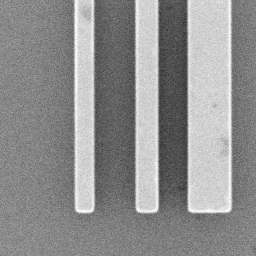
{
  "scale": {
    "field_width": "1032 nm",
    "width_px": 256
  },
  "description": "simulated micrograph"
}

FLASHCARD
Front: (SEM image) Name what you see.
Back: groups of lines, slits or small figures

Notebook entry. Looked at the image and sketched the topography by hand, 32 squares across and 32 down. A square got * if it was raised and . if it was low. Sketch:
.........***.....***....*****...
.........***.....***....*****...
.........***.....***....*****...
.........***.....***....*****...
.........***.....***....*****...
.........***.....***....*****...
.........***.....***....*****...
.........***.....***....*****...
.........***.....***....*****...
.........***.....***....*****...
.........***.....***....*****...
.........***.....***....*****...
.........***.....***....*****...
.........***.....***....*****...
.........***.....***....*****...
.........***.....***....*****...
.........***.....***....*****...
.........***.....***....*****...
.........***.....***....*****...
.........***.....***....*****...
.........***.....***....*****...
.........***.....***....*****...
.........***.....***....*****...
.........***.....***....*****...
..........**.....***....*****...
..........**.....***....*****...
................................
................................
................................
................................
................................
................................